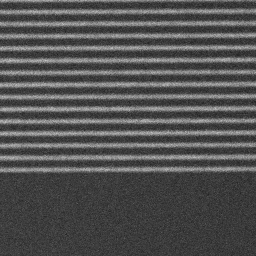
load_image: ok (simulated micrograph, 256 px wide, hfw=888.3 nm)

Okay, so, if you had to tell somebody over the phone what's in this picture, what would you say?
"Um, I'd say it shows parallel lines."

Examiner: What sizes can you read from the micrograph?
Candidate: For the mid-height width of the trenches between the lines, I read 30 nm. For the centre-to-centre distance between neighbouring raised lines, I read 42.3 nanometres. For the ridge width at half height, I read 0.0117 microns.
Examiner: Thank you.